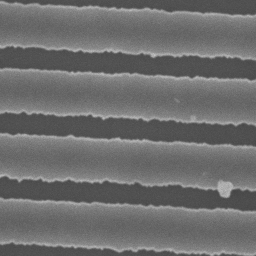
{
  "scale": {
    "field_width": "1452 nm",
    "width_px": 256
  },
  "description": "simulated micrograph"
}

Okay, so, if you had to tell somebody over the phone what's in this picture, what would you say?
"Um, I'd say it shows lines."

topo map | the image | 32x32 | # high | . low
###.#...........................
#####################.##........
################################
################################
################################
################################
...........##.##################
................................
................................
#####################...........
################################
################################
################################
################################
.......#.#.#####################
...........................###.#
................................
##################..............
################################
################################
################################
################################
..#..###########################
.........................#######
................................
#############.#.................
################################
################################
################################
################################
#.##############################
......................##########